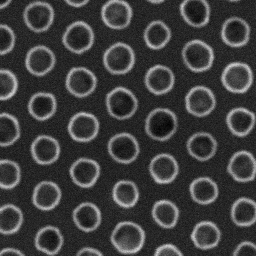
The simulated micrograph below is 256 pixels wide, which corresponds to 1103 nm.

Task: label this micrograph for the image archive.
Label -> a regular array of raised bodies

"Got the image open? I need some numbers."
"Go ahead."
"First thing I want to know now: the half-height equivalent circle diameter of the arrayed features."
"0.117 µm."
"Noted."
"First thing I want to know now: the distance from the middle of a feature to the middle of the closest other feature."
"0.192 microns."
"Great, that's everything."